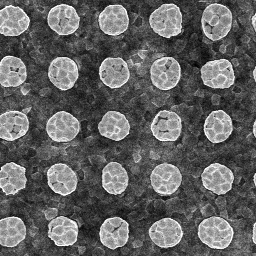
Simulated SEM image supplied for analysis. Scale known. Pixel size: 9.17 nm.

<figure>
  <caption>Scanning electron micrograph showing a regular array of raised bodies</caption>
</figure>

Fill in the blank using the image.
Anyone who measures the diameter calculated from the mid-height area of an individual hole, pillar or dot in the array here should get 266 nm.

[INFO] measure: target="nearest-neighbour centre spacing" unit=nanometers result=464